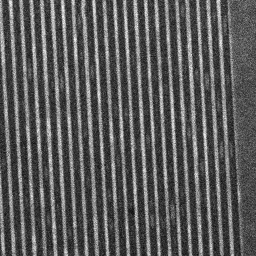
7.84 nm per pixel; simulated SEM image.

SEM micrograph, parallel lines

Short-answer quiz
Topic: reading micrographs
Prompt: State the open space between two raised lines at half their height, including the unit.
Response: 55.7 nanometres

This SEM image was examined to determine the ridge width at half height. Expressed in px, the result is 3.12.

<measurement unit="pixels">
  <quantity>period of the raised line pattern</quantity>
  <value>10.4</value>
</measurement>